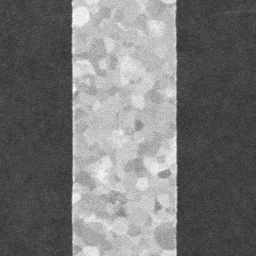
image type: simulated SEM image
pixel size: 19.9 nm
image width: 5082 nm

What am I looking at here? one or a few lines or trenches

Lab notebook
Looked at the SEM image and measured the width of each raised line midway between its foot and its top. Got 2040 nm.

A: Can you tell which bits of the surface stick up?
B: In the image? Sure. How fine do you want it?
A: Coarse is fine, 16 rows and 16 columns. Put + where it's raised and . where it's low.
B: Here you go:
.....++++++.....
.....++++++.....
.....++++++.....
.....++++++.....
.....++++++.....
.....++++++.....
.....++++++.....
.....++++++.....
.....++++++.....
.....++++++.....
.....++++++.....
.....++++++.....
.....++++++.....
.....++++++.....
.....++++++.....
.....++++++.....